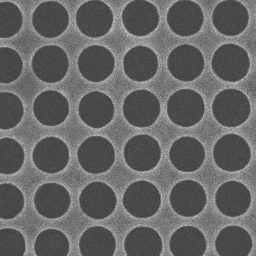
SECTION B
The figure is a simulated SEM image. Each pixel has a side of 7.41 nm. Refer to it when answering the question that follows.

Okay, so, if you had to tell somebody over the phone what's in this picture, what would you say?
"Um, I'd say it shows a regular array of holes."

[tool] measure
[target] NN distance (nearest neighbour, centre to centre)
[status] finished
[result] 44.5 px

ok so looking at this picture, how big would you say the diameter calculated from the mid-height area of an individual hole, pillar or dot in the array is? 36.9 pixels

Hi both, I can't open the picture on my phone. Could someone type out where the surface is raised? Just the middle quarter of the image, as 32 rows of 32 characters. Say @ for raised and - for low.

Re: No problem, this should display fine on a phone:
-@@----------@@---------@@------
-@@@--------@@@--------@@@------
-@@@--------@@@--------@@@@-----
@@@@@------@@@@@------@@@@@@----
@@@@@@@--@@@@@@@@@@@@@@@@@@@@@@@
@@@@@@@@@@@@@@@@@@@@@@@@@@@@@@@@
@@@@@@@@@@@@@@@@@@@-@@@@@@@@@---
@@@@@@----@@@@@@------@@@@@-----
@@@@@------@@@@--------@@@------
-@@@--------@@@---------@@------
-@@@--------@@@---------@@------
-@@----------@@---------@@------
-@@@---------@@---------@@------
@@@@--------@@@--------@@@------
@@@@@------@@@@@-------@@@@-----
@@@@@@----@@@@@@@-----@@@@@@@---
@@@@@@@@@@@@@@@@@@@@@@@@@@@@@@@@
@@@@@@@@@@@@@@@@@@@@@@@@@@@@@@@@
@@@@@@----@@@@@@@-----@@@@@@@---
@@@@@------@@@@@-------@@@@-----
-@@@--------@@@---------@@@-----
-@@----------@@---------@@------
-@@----------@@---------@@------
-@@----------@@---------@@------
-@@@--------@@@---------@@@-----
-@@@--------@@@@-------@@@@@----
@@@@@------@@@@@@-----@@@@@@@---
@@@@@@@--@@@@@@@@@@@@@@@@@@@@@@@
@@@@@@@@@@@@@@@@@@@@@@@@@@@@@@@@
@@@@@@@--@@@@@@@@@---@@@@@@@@---
@@@@@@-----@@@@@-------@@@@@----
-@@@@-------@@@@-------@@@@-----